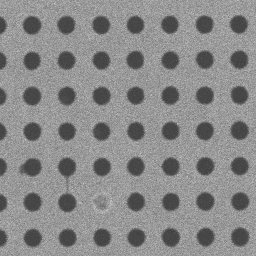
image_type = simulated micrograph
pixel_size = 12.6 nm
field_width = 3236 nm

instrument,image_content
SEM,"a regular array of holes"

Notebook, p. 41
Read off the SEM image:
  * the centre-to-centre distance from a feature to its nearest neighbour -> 0.436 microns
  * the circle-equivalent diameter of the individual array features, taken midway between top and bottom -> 234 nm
